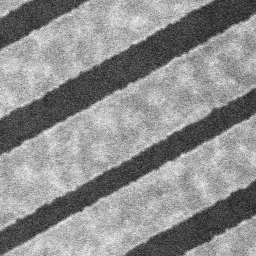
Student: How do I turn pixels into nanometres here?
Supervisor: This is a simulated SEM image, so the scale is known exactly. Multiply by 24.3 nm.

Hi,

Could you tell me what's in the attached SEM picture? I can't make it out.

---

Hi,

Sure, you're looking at one or a few lines or trenches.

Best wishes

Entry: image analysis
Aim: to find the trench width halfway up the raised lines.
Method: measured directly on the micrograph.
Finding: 747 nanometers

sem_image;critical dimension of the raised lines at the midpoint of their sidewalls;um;1.43